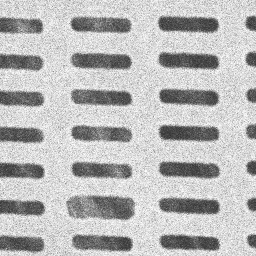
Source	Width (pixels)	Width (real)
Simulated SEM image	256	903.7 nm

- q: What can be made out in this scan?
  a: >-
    a regular array of holes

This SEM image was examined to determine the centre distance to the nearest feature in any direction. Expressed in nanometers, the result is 128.